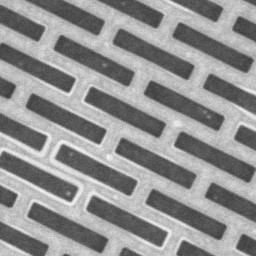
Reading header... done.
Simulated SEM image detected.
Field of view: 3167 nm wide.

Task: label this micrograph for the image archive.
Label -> groups of lines, slits or small figures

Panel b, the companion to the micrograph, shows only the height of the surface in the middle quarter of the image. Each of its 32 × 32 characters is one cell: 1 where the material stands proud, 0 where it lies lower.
11111000000000011111111000000000
11111110000000000111111110000000
00111111100000000011111111100000
00011111111000000111111111111001
00011111111110000111100111111111
00011111111111100111100001111111
00111100001111111111000000001111
11111000000011111111000000000111
11111000000001111111100000000001
11111000000000011111111000000000
11111100000000000111111110000000
00111111100000000001111111100000
00001111111000000000011111111000
00000011111110000000000111111110
00000000111111100000000001111111
00000000011111111000000001111111
00000000000111111110000001111111
11100000000111111111100011111001
11110000001111011111111011110000
11111100001110000111111111110000
00111111011110000001111111100000
00001111111110000000011111110000
00000011111110000000000011111110
00000000111111100000000000111111
00000000001111110000000000001111
00000000000111111100000000000111
10000000000001111111000000000001
11110000000000001111111000000000
01111100000000000011111110000000
00011111000000000001111111100000
00001111110000000011111111111000
00001111111100000011110111111111